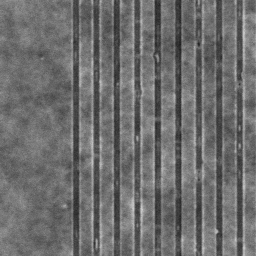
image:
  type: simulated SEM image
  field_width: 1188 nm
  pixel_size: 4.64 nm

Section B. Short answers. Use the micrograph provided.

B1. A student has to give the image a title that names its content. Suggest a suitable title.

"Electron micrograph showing parallel lines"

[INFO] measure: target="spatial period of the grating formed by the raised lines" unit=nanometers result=95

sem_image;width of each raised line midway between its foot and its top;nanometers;65.6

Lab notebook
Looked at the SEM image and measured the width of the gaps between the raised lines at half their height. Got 30.8 nm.